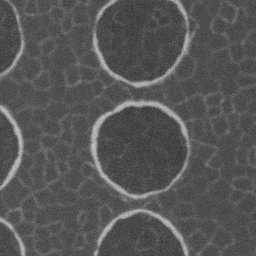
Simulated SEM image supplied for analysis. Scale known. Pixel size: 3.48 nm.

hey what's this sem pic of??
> holes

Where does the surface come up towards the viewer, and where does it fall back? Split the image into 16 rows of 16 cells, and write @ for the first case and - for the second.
-@@@@@@----@@@@@
-@@@@@------@@@@
-@@@@@------@@@@
-@@@@@-----@@@@@
@@@@@@@----@@@@@
@@@@@@@@@@@@@@@@
@@@@@@@@@@@@@@@@
-@@@@@-----@@@@@
-@@@@@------@@@@
-@@@@@------@@@@
-@@@@@-----@@@@@
@@@@@@@----@@@@@
@@@@@@@@@@@@@@@@
@@@@@@@@--@@@@@@
-@@@@@@----@@@@@
-@@@@@------@@@@